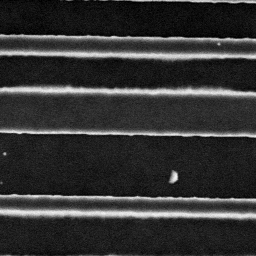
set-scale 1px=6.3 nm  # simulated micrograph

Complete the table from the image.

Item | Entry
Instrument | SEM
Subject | lines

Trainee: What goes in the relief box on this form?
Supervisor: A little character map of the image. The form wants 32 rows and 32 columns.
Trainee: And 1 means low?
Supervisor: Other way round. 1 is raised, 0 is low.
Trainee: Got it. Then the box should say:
00000000000000000000000000000000
00000000000000000000000000000000
00000000000000000000000000000000
00000000000000000000000000000000
11111111000100000000000000000000
11111111111111111111111111111111
11111111111111111111111111111111
00000000000000000000000000000000
00000000000000000000000000000000
00000000000000000000000000000000
00000000000000000000000000000000
11111111111111111111100101000000
11111111111111111111111111111111
11111111111111111111111111111111
11111111111111111111111111111111
11111111111111111111111111111111
11111111111111111111111111111111
00000000000000000000000000000000
00000000000000000000000000000000
00000000000000000000000000000000
00000000000000000000000000000000
00000000000000000000000000000000
00000000000000000000000000000000
00000000000000000000000000000000
11111111000000000000000000000000
11111111111111111111111111111111
01111111111111111111111111111111
00000000000000000000000000000000
00000000000000000000000000000000
00000000000000000000000000000000
00000000000000000000000000000000
00000000000000000000000000000000